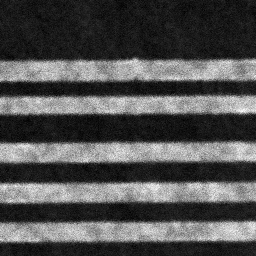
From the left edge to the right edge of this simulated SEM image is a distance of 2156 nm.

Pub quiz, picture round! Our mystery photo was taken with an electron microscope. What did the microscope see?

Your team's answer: parallel lines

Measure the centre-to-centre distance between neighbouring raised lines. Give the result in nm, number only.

338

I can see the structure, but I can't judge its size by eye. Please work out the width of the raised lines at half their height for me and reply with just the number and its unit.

149 nm